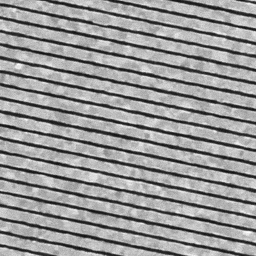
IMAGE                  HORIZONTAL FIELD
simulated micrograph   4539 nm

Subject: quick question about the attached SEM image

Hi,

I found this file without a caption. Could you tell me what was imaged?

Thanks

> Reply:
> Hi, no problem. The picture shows parallel lines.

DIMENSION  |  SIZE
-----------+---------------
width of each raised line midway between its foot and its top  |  165 nanometres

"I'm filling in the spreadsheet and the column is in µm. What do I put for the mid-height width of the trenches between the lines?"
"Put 0.0738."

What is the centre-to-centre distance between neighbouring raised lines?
233 nm